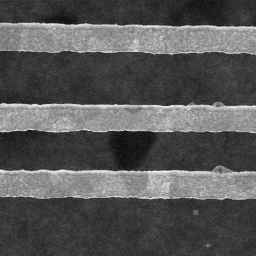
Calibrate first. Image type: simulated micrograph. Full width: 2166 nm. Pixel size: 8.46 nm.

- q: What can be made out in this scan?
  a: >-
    lines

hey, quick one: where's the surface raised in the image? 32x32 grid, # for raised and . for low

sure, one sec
................................
................................
................................
################################
################################
################################
......#...#.###...########..####
................................
................................
................................
................................
................................
................................
################################
################################
################################
...............................#
................................
................................
................................
................................
#########.##.#.#.....#.....##...
################################
################################
.#.#############################
................................
................................
................................
................................
................................
................................
................................